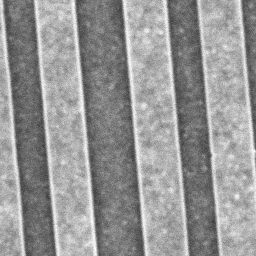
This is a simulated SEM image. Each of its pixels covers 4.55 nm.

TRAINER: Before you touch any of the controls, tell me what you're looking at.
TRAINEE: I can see one or a few lines or trenches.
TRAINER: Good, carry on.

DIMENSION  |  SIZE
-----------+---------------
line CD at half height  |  40.7 px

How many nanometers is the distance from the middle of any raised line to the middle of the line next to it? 384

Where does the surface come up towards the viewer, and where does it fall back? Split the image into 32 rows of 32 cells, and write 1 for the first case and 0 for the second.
00001111100000001111100001111100
00000111100000001111100001111100
00000111100000001111100001111100
00000111100000001111100001111100
10000111110000001111100001111100
10000111110000001111100001111100
10000111110000001111100001111110
10000111110000001111100001111110
10000111110000001111100000111110
10000111110000001111100000111110
10000111110000001111110000111110
10000111110000000111110000111110
10000011110000000111110000111110
10000011110000000111110000111110
11000011110000000111110000111110
11000011111000000111110000111110
11000011111000000111110000111110
11000011111000000111110000111110
11000011111000000111110000111111
11000011111000000111110000011111
11000011111000000111111000011111
11000011111000000111111000011111
11000011111000000111111000011111
11000011111000000011111000011111
11000011111000000011111000011111
11100001111000000011111000011111
11100001111000000011111000011111
11100001111100000011111000011111
11100001111100000011111000011111
11100001111100000011111000011111
11100001111100000011111000011111
11100001111100000011111000001111